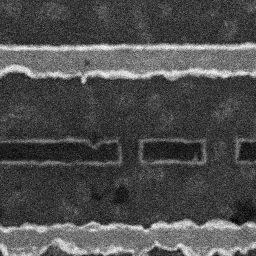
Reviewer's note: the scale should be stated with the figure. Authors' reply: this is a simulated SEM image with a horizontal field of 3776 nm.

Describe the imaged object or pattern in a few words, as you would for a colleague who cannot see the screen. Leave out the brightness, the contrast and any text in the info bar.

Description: one or a few lines or trenches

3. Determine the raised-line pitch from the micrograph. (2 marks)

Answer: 1320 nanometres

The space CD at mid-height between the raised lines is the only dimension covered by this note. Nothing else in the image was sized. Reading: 955 nanometers